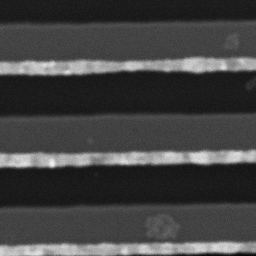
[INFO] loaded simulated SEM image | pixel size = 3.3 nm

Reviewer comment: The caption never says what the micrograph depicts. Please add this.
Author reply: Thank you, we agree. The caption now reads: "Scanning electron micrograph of lines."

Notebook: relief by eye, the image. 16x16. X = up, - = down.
----------------
-------X-XXXXXXX
XXXXXXXXXXXXXXXX
XXXXXXXXXXXXXXXX
XXXXXXX-----X---
----------------
----------------
XXXXXXXXXXXXXXXX
XXXXXXXXXXXXXXXX
XXXXXXXXXXXXXXXX
----------------
----------------
----------------
XXXXXXXXXXXXXXXX
XXXXXXXXXXXXXXXX
XXXXXXXXXXXXXXXX